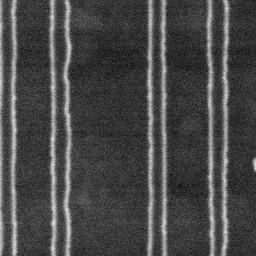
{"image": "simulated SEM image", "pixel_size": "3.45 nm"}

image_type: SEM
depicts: lines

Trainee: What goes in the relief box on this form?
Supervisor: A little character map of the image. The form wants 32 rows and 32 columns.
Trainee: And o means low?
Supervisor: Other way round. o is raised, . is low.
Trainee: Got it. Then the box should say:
oo....ooo..........oo.....oo....
oo....ooo..........oo.....oo....
oo....oo...........oo.....oo....
oo....oo...........oo.....oo....
oo....ooo..........oo.....oo....
oo....ooo..........oo.....oo....
oo....ooo..........oo.....oo....
oo....ooo..........oo.....oo....
oo....oo...........oo.....oo....
oo....oo...........oo.....oo....
oo....oo...........oo.....oo....
oo....oo...........oo.....oo....
oo.....o...........oo.....oo....
oo.....o...........oo.....oo....
oo.....oo..........oo.....oo....
oo.....oo..........oo.....oo....
oo.....oo..........oo.....oo....
oo....ooo..........oo.....oo....
oo....ooo..........oo.....oo....
oo....ooo..........oo.....oo....
oo....ooo..........oo.....oo....
oo....ooo..........oo.....oo....
oo.....oo..........oo.....oo....
oo.....oo..........oo.....oo....
oo....oo...........oo.....oo....
oo.....o...........oo.....oo....
oo.....oo..........oo.....oo....
oo.....oo..........oo.....oo....
oo.....oo..........oo.....oo....
oo.....oo..........oo.....oo....
oo....ooo..........oo.....oo....
oo....oo...........oo.....oo....